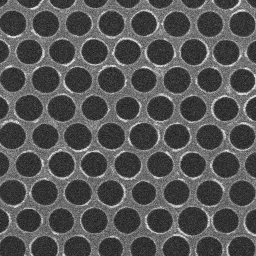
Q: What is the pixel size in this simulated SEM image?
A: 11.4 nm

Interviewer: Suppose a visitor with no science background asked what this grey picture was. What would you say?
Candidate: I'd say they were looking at a regular array of holes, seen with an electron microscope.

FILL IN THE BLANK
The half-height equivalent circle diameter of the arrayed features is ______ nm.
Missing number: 297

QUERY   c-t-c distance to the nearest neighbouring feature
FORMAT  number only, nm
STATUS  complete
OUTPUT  369